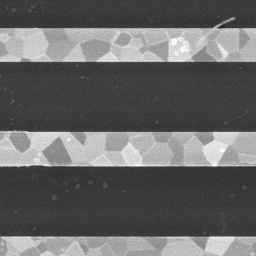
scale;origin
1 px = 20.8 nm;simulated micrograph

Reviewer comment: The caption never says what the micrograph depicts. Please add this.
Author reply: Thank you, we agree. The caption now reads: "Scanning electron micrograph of lines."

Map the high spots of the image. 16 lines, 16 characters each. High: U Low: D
DDDDDDDDDDDDDDDD
DDDDDDDDDDDDDDDD
UUUUUUUUUUUUUUUU
UUUUUUUUUUUUUUUU
DDDDDDDDDDDDDDDD
DDDDDDDDDDDDDDDD
DDDDDDDDDDDDDDDD
DDDDDDDDDDDDDDDD
UUUUUUUUUUUUUUUU
UUUUUUUUUUUUUUUU
DDDDDDDDDDDDDDDD
DDDDDDDDDDDDDDDD
DDDDDDDDDDDDDDDD
DDDDDDDDDDDDDDDD
DDDDDDDDDDDDDDDD
UUUUUUUUUUUUUUUU